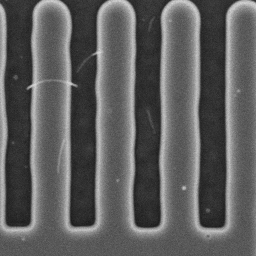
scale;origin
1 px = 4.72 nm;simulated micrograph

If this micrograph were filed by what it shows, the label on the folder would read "groups of lines, slits or small figures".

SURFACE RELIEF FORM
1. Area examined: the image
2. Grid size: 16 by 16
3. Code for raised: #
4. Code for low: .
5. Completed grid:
..##..##..##...#
..##..##..##..##
..##..##..##..##
..##..##..##..##
..##..##..##..##
..##..##..##..##
..##..##..##..##
..##..##..##..##
..##..##..##..##
..##..##..##..##
..##..##..##..##
..##..##..##..##
..##..##..##..##
..##..##..##..##
################
################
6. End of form